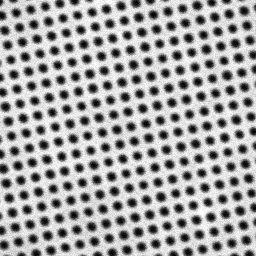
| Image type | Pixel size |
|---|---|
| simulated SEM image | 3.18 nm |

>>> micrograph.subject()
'a regular array of holes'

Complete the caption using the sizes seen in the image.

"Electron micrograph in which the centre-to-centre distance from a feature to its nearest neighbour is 0.0468 µm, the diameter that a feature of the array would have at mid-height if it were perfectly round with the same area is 9.15 px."